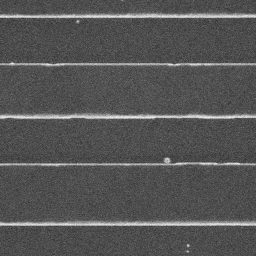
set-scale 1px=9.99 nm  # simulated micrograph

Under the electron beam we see lines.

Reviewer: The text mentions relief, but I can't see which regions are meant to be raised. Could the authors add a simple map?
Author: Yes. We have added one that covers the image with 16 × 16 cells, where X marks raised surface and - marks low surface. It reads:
XXXXXXXXXXXXXXXX
----------------
----------------
----------------
XXXXXXXXXXXXXXXX
XXXXXXXXXXXXXXXX
XXXXXXXXXXXXXXXX
----------------
----------------
----------------
XXXXXXXXXXXXXXXX
XXXXXXXXXXXXXXXX
XXXXXXXXXXXXXXXX
XXXXXXXXXXXXXXXX
----------------
----------------